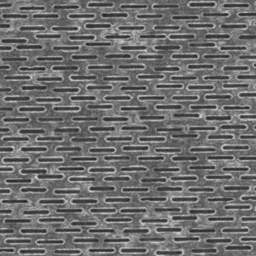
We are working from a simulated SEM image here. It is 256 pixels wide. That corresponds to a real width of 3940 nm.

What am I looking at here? a regular array of holes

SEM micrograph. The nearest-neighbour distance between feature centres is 275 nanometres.